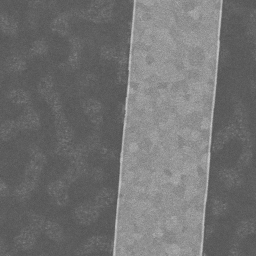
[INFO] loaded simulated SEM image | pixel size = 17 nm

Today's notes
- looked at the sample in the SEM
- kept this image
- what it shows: one or a few lines or trenches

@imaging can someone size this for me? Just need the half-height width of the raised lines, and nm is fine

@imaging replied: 1490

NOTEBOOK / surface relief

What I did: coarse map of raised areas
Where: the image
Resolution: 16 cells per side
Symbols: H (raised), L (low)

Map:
LLLLLLLLHHHHHHLL
LLLLLLLLHHHHHHLL
LLLLLLLLHHHHHHLL
LLLLLLLLHHHHHHLL
LLLLLLLLHHHHHHLL
LLLLLLLLHHHHHLLL
LLLLLLLLHHHHHLLL
LLLLLLLLHHHHHLLL
LLLLLLLLHHHHHLLL
LLLLLLLLHHHHHLLL
LLLLLLLLHHHHHLLL
LLLLLLLHHHHHHLLL
LLLLLLLHHHHHHLLL
LLLLLLLHHHHHHLLL
LLLLLLLHHHHHHLLL
LLLLLLLHHHHHHLLL